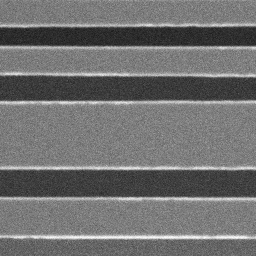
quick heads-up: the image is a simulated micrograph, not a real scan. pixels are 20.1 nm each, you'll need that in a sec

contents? lines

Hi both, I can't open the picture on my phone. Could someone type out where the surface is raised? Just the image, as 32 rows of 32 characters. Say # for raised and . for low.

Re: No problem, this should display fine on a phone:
################################
################################
################################
................................
................................
................................
################################
################################
################################
..........................##.###
................................
................................
................................
################################
################################
################################
################################
################################
################################
################################
################################
................................
................................
................................
................................
################################
################################
################################
################################
################################
................................
................................